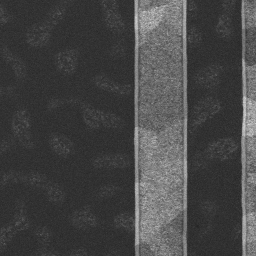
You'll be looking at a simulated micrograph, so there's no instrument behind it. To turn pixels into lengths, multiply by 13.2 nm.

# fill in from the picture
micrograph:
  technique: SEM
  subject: one or a few lines or trenches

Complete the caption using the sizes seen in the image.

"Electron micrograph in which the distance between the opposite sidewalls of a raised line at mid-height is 0.644 microns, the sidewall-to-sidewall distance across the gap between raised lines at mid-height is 770 nm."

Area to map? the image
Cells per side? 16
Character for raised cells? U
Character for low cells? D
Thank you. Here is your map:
DDDDDDDDDUUUDDDU
DDDDDDDDDUUUDDDU
DDDDDDDDDUUUDDDU
DDDDDDDDDUUUDDDU
DDDDDDDDDUUUDDDU
DDDDDDDDDUUUDDDU
DDDDDDDDDUUUDDDU
DDDDDDDDDUUUDDDU
DDDDDDDDDUUUDDDU
DDDDDDDDDUUUDDDU
DDDDDDDDDUUUDDDU
DDDDDDDDDUUUDDDU
DDDDDDDDDUUUDDDU
DDDDDDDDDUUUDDDU
DDDDDDDDDUUUDDDU
DDDDDDDDDUUUDDDU